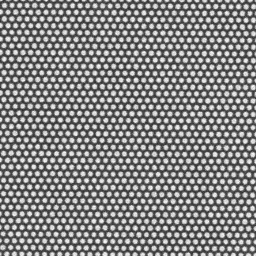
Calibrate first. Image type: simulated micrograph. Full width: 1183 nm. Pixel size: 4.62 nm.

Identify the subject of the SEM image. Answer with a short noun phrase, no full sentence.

a regular array of raised bodies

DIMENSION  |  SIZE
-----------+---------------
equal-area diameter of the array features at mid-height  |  22.7 nanometers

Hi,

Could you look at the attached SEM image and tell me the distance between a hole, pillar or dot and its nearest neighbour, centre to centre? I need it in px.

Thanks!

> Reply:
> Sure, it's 7.34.